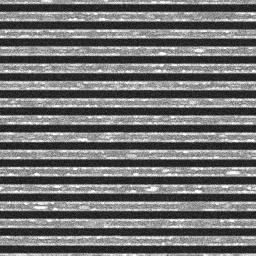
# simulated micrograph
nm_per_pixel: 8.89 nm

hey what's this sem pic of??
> parallel lines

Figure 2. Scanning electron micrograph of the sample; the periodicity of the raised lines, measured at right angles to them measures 153 nanometers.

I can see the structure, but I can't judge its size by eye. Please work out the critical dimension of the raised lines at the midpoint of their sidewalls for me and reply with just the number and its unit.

0.0823 micrometres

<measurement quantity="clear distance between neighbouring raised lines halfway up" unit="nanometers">74.5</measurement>